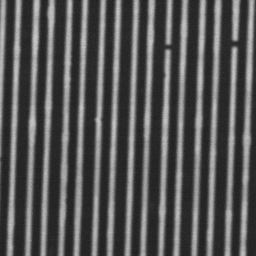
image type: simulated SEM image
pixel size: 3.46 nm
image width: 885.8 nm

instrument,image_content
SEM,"parallel lines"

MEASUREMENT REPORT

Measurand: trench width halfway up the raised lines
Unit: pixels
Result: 11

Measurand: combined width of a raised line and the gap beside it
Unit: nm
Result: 57.6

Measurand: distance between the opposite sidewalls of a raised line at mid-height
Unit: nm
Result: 17.7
